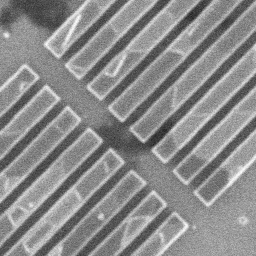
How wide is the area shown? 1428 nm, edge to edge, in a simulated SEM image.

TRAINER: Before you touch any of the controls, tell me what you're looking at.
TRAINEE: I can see groups of lines, slits or small figures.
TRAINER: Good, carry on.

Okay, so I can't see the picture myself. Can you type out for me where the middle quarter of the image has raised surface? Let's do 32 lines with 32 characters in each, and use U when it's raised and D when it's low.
DUUUUUUDDDDUUUUUUUDDDDUUUUUUDDDD
DDUUUUDDDDUUUUUUUDDDUUUUUUUDDDDU
DDDUUDDDDUUUUUUUDDDDUUUUUUDDDDUU
DDDDDDDDUUUUUUUDDDDUUUUUUDDDDUUU
DDDDDDDUUUUUUUDDDDUUUUUUDDDDUUUU
DDDDDDUUUUUUUDDDDUUUUUUDDDDUUUUU
DDDDDDDUUUUUDDDDUUUUUUDDDDUUUUUU
DDDDDDDDUUUDDDDUUUUUUDDDDUUUUUUU
DDDDDDDDDUDDDDUUUUUUDDDDUUUUUUUD
DDDDDDDDDDDDUUUUUUUDDDDUUUUUUUDD
DDDDDDDDDDDDUUUUUUDDDDUUUUUUUDDD
UDDDDDDDDDDDUUUUUDDDDUUUUUUUDDDD
UUUDDDDDDDDDDUUUDDDDUUUUUUUDDDDU
UUUDDDDDDDDDDDUDDDDDUUUUUUDDDDUU
UUUUDDDDDDDDDDDDDDUUUUUUUDDDDUUU
UUUDDDDDDDDDDDDDDUUUUUUUDDDDUUUU
UUDDDDDDDDDDDDDDDUUUUUUDDDDUUUUU
UDDDDUUUDDDDDDDDDDUUUUDDDDUUUUUU
DDDDUUUUUDDDDDDDDDDUUDDDDUUUUUUU
DDDUUUUUUDDDDDDDDDDDDDDDUUUUUUUD
DDUUUUUUDDDDDDDDDDDDDDDUUUUUUUDD
DUUUUUUDDDDDDDDDDDDDDDUUUUUUUDDD
UUUUUUDDDDUUUDDDDDDDDDDUUUUUDDDD
UUUUUDDDDUUUUUDDDDDDDDDDUUUDDDUU
UUUUDDDDDUUUUUDDDDDDDDDDDDDDDDUU
UUUDDDDUUUUUUUDDDDDDDDDDDDDDUUUU
UUDDDDUUUUUUUDDDDDDDDDDDDDDDUUUU
UDDDDUUUUUUUDDDDUUDDDDDDDDDDUUUU
DDDDUUUUUUUDDDDUUUUDDDDDDDDDDUUU
DDDDUUUUUUDDDDUUUUUUDDDDDDDDDDUD
DDDUUUUUUDDDDUUUUUUUDDDDDDDDDDDD
DUUUUUUUDDDDUUUUUUUDDDDDDDDDDDDD